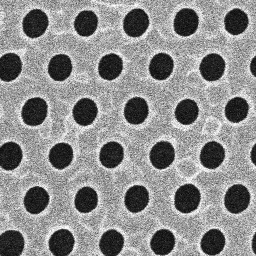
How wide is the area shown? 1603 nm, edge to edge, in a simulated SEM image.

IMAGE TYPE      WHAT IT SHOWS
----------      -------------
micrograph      a regular array of holes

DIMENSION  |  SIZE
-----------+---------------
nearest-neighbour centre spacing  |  313 nm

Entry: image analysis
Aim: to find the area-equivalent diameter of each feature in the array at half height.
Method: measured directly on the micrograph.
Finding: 167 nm